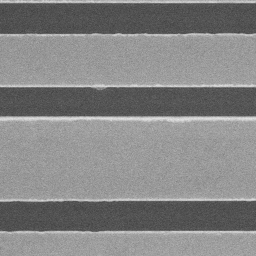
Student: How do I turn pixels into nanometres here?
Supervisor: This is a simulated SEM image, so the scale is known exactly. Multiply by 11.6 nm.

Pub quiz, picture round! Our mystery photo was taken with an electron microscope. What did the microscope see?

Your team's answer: lines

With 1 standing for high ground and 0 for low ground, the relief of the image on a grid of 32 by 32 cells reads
00000000000000000000000000000000
00000000000000000000000000000000
00000000000000000000000000000000
00000000000000000000000000000000
11111111111111111111111111111111
11111111111111111111111111111111
11111111111111111111111111111111
11111111111111111111111111111111
11111111111111111111111111111111
11111111111111111111111111111111
11111111111111111111111111111111
00000000000000000000000000000000
00000000000000000000000000000000
00000000000000000000000000000000
00000000000000000000000000000000
11111111111111111111111111111111
11111111111111111111111111111111
11111111111111111111111111111111
11111111111111111111111111111111
11111111111111111111111111111111
11111111111111111111111111111111
11111111111111111111111111111111
11111111111111111111111111111111
11111111111111111111111111111111
11111111111111111111111111111111
00000000000000000000000000000000
00000000000000000000000000000000
00000000000000000000000000000000
00000000000000000000000000000000
11111111111111111111111111111111
11111111111111111111111111111111
11111111111111111111111111111111